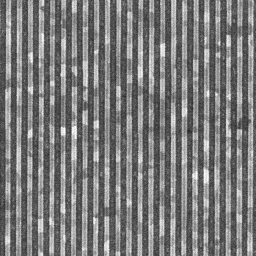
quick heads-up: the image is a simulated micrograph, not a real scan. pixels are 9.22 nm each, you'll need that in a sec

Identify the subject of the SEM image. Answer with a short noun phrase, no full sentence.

parallel lines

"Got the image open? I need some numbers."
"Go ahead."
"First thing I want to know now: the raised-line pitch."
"102 nm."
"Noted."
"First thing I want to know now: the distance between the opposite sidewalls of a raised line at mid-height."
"34.6 nanometres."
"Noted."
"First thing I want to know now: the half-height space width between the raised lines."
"70.3 nm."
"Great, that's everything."